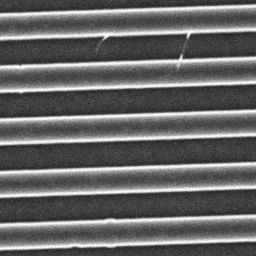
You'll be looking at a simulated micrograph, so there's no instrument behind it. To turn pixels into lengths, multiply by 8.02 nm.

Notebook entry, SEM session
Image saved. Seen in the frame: parallel lines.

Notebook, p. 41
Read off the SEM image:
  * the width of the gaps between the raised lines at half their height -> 225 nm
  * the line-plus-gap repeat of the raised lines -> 421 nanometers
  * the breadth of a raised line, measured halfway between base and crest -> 24.4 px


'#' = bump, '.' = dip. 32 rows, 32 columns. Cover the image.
................................
..........######################
################################
################################
#########.......................
................................
................................
...........................#####
################################
################################
#########################.###...
................................
................................
................................
..............##################
################################
################################
#############...................
................................
................................
..............................##
..##############################
################################
#############################...
#...............................
................................
................................
..................##############
################################
################################
#################...............
................................